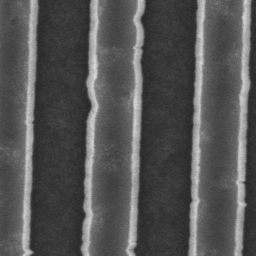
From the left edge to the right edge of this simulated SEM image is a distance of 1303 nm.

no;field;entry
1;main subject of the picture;one or a few lines or trenches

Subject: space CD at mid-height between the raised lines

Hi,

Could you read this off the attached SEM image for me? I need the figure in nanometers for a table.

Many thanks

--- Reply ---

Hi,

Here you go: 293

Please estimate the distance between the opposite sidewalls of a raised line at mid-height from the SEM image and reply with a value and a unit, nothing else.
250 nm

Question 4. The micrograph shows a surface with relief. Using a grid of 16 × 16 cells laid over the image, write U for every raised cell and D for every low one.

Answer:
UUDDDDUUUDDDUUUU
UUDDDDUUUDDDUUUD
UUDDDDUUUDDDUUUD
UUDDDDUUUDDDUUUD
UUDDDDUUUDDDUUUD
UUDDDDUUUDDDUUUD
UUDDDDUUUDDDUUUD
UUDDDDUUUDDDUUUD
UUDDDDUUUDDDUUUD
UUDDDDUUUDDDUUUD
UUDDDUUUUDDDUUUD
UUDDDUUUUDDDUUUD
UUDDDUUUDDDDUUUD
UUDDDUUUDDDDUUUD
UUDDDUUUDDDDUUUD
UUDDDUUUDDDDUUUD